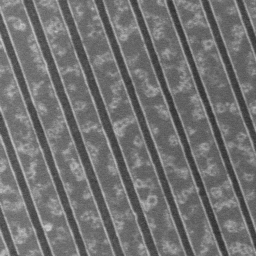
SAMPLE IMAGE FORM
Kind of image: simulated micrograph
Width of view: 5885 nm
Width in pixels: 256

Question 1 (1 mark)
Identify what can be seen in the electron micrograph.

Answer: parallel lines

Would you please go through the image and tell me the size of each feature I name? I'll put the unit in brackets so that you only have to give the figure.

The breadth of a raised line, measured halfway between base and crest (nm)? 560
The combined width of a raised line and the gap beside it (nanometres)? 765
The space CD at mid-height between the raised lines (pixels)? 8.82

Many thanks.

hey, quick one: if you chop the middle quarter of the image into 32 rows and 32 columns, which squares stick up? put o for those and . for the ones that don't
oooo...oooooo...oooooo..ooooooo.
ooooo..ooooooo..oooooo...oooooo.
ooooo...oooooo..ooooooo..ooooooo
ooooo...oooooo...oooooo..ooooooo
ooooo...ooooooo..oooooo...oooooo
oooooo...oooooo...oooooo..oooooo
oooooo...oooooo...oooooo..oooooo
.oooooo..ooooooo..ooooooo..ooooo
.oooooo...oooooo..ooooooo..ooooo
.oooooo...oooooo...oooooo...oooo
..oooooo..ooooooo..ooooooo..oooo
..oooooo...oooooo...oooooo..oooo
...ooooo...ooooooo..oooooo...ooo
...oooooo..ooooooo..ooooooo..ooo
...oooooo...oooooo...oooooo..ooo
o...ooooo...ooooooo..oooooo...oo
o...oooooo...oooooo..ooooooo..oo
oo..oooooo...oooooo...oooooo...o
oo...oooooo..ooooooo..ooooooo..o
oo...oooooo...oooooo...oooooo..o
ooo..oooooo...oooooo...oooooo...
ooo...oooooo..ooooooo..ooooooo..
oooo..oooooo...oooooo...oooooo..
oooo...oooooo..ooooooo..oooooo..
oooo...oooooo..ooooooo..ooooooo.
oooo...oooooo...oooooo...oooooo.
ooooo...ooooo...ooooooo..oooooo.
ooooo...oooooo...oooooo..ooooooo
oooooo..oooooo...oooooo...oooooo
oooooo...ooooo...ooooooo..oooooo
oooooo...oooooo...oooooo...ooooo
ooooooo..oooooo...oooooo...ooooo